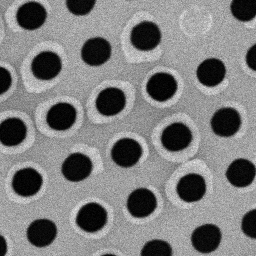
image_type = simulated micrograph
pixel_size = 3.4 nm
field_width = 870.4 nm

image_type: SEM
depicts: a regular array of holes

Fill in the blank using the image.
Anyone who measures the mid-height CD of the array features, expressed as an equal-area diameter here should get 95.8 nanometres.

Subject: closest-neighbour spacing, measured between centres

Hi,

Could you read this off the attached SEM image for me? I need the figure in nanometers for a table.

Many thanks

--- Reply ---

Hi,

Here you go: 176